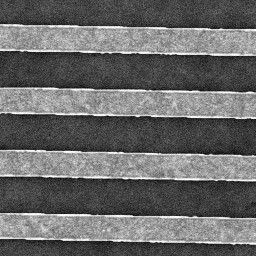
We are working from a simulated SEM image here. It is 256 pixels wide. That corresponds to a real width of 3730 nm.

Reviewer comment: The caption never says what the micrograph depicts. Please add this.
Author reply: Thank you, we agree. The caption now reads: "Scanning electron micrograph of lines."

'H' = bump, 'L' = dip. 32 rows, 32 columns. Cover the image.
LLLLLLLLLLLLLLLLLLLLLLLLLLLLLLLL
LLLLLLLLLLLLLLLLLLLLLLLLLLLLLLLL
LLLLLLLLLLLLLLLLLLLLLLLLLLLLLLLL
HHHHHHHHHHHHHHHLLLLLLLLLLLLLLLLL
HHHHHHHHHHHHHHHHHHHHHHHHHHHHHHHH
HHHHHHHHHHHHHHHHHHHHHHHHHHHHHHHH
LLLLLLLLLLLLHLLHHHHHHHHHHHHHHHHH
LLLLLLLLLLLLLLLLLLLLLLLLLLLLLLLL
LLLLLLLLLLLLLLLLLLLLLLLLLLLLLLLL
LLLLLLLLLLLLLLLLLLLLLLLLLLLLLLLL
LLLLLLLLLLLLLLLLLLLLLLLLLLLLLLLL
HHHHHHHHHHHHHHHHHHHHHHHHLLLLLLLL
HHHHHHHHHHHHHHHHHHHHHHHHHHHHHHHH
HHHHHHHHHHHHHHHHHHHHHHHHHHHHHHHH
LLLLLLLLLLLLLLLLLHLHHHHHHHHHHHHH
LLLLLLLLLLLLLLLLLLLLLLLLLLLLLLLL
LLLLLLLLLLLLLLLLLLLLLLLLLLLLLLLL
LLLLLLLLLLLLLLLLLLLLLLLLLLLLLLLL
LLLLLLLLLLLLLLLLLLLLLLLLLLLLLLLL
HHHHHHHHHHHHHHHHHHHHHHHHHHHHHHLL
HHHHHHHHHHHHHHHHHHHHHHHHHHHHHHHH
HHHHHHHHHHHHHHHHHHHHHHHHHHHHHHHH
LLLLLLLLLLLLLLLLLLLLLLLLLLLLLHHH
LLLLLLLLLLLLLLLLLLLLLLLLLLLLLLLL
LLLLLLLLLLLLLLLLLLLLLLLLLLLLLLLL
LLLLLLLLLLLLLLLLLLLLLLLLLLLLLLLL
LLLLLLLLLLLLLLLLLLLLLLLLLLLLLLLL
HHHHHHHHHHHHHHHHHHHHHHHHHHHHHHHH
HHHHHHHHHHHHHHHHHHHHHHHHHHHHHHHH
HHHHHHHHHHHHHHHHHHHHHHHHHHHHHHHH
LLLLLLLLLLLLLLLLLLLLLLLLLLLLLLLL
LLLLLLLLLLLLLLLLLLLLLLLLLLLLLLLL